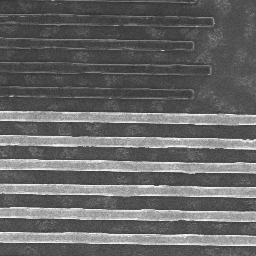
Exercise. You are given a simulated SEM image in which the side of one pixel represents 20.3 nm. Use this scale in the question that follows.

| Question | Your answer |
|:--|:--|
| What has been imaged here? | parallel lines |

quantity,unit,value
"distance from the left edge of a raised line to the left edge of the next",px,24.2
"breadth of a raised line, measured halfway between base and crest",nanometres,198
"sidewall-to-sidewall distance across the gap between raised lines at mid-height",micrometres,0.294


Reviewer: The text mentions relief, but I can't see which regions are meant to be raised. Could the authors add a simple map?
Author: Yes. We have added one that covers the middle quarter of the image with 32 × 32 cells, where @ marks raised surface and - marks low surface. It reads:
@@@@@@@@@@@@@@@@@@@@@@@@@@@@@@@-
@@@@@@@@@@@@@@@@@@@@@@@@@@@@@@@@
---------------------------@@@@@
--------------------------------
--------------------------------
--------------------------------
@@@@@@@@@@@@@@@@@@@@@@@@--------
@@@@@@@@@@@@@@@@@@@@@@@@@@@@@@@@
-------------------@@--@@@-@-@@@
--------------------------------
--------------------------------
--------------------------------
@@@@@@@@@@@@@@@@@@@@@@@@@@@-----
@@@@@@@@@@@@@@@@@@@@@@@@@@@@@@@@
-------------------@@@@@@@@@@@@@
--------------------------------
--------------------------------
--------------------------------
@@@@@@@@@@@@@-@@---@@@@@-@@-----
@@@@@@@@@@@@@@@@@@@@@@@@@@@@@@@@
-@@------------@@@@@@@@@@@@---@@
--------------------------------
--------------------------------
--------------------------------
@@@@@@@@@@@@@@@@@---------------
@@@@@@@@@@@@@@@@@@@@@@@@@@@@@@@@
------@@@@@@@@@@@@@@@@@@@@@@@@@@
--------------------------------
--------------------------------
--------------------------------
@@@@@-------@@@@@@@-------------
@@@@@@@@@@@@@@@@@@@@@@@@@@@@@@@@